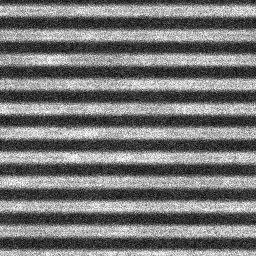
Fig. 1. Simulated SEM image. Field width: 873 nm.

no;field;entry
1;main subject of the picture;parallel lines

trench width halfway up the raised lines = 48.6 nm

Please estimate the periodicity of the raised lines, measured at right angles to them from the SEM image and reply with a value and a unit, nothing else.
83.5 nanometres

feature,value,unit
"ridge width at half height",0.0354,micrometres